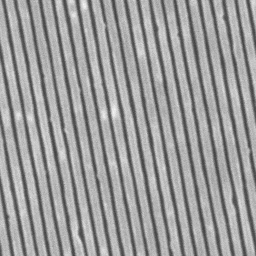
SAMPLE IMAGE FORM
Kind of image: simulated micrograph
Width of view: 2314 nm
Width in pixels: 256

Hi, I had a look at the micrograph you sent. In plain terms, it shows parallel lines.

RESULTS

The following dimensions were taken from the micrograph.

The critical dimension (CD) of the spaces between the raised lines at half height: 38.9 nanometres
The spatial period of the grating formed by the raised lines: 0.109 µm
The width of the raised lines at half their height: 70.1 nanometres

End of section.